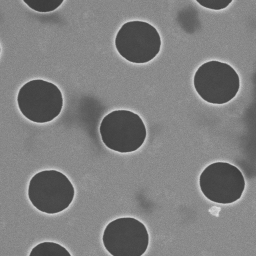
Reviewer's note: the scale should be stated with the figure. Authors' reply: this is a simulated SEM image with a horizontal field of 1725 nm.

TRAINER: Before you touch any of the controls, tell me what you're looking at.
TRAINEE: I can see holes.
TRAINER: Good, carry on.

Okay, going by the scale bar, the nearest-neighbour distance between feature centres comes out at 596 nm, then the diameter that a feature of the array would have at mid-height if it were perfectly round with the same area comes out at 296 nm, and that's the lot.